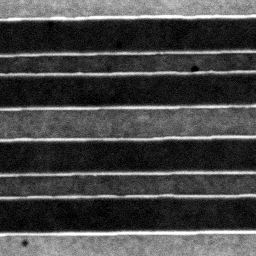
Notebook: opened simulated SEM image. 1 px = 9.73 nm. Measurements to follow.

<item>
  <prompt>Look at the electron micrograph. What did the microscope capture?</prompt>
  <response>lines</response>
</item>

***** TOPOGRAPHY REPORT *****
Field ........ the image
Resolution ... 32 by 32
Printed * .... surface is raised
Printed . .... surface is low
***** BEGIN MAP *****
................................
................................
********************************
********************************
********************************
********************************
********************************
................................
................................
********************************
********************************
********************************
********************************
***********************.........
................................
................................
................................
********************************
********************************
********************************
********************************
********************************
................................
................................
............********************
********************************
********************************
********************************
********************************
................................
................................
................................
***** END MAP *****